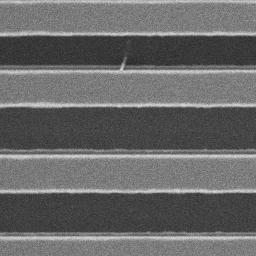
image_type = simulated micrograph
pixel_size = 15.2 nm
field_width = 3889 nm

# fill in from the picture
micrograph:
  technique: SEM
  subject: lines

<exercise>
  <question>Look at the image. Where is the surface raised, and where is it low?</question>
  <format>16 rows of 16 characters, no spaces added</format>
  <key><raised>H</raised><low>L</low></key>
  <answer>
HHHHHHHHHHHHHHHH
HHHHHHHHHHHHHHHH
LLLLLLLLLLLLLLLL
LLLLLLLLLLLLLLLL
HHHHHHHHHHHHHHHH
HHHHHHHHHHHHHHHH
HHHHHHHHHHHHHHHH
LLLLLLLLLLLLLLLL
LLLLLLLLLLLLLLLL
HHHHHHHHHHHHHHHH
HHHHHHHHHHHHHHHH
HHHHHHHHHHHHHHHH
LLLLLLLLLLLLLLLL
LLLLLLLLLLLLLLLL
LLLLLLLLLLLLLLLL
HHHHHHHHHHHHHHHH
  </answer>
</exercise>